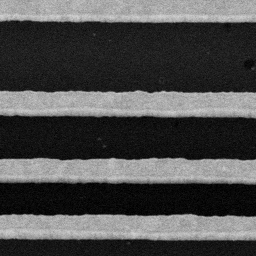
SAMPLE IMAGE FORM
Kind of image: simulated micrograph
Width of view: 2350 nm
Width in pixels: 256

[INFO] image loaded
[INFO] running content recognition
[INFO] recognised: lines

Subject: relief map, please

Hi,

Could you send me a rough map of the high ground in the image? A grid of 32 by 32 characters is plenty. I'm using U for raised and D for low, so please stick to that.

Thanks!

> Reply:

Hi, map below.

UUUUUUUUUUUUUUUUUUUUUUUUUUUUUUUU
UUUUUUUUUUUUUUUUUUUUUUUUUUUUUUUU
DDDDDDDDDDDDDDDDDDDDDDDDDDDDDDDD
DDDDDDDDDDDDDDDDDDDDDDDDDDDDDDDD
DDDDDDDDDDDDDDDDDDDDDDDDDDDDDDDD
DDDDDDDDDDDDDDDDDDDDDDDDDDDDDDDD
DDDDDDDDDDDDDDDDDDDDDDDDDDDDDDDD
DDDDDDDDDDDDDDDDDDDDDDDDDDDDDDDD
DDDDDDDDDDDDDDDDDDDDDDDDDDDDDDDD
DDDDDDDDDDDDDDDDDDDDDDDDDDDDDDDD
DDDDDDDDDDDDDDDDDDDDDDDDDDDDDDDD
DDDUDDDDDDDDDDDDDUDDDDDDDDDDDDDD
UUUUUUUUUUUUUUUUUUUUUUUUUUUUUUUU
UUUUUUUUUUUUUUUUUUUUUUUUUUUUUUUU
DDDDDDDDDDDDDDDDDDDDDDDDDDDDDDDD
DDDDDDDDDDDDDDDDDDDDDDDDDDDDDDDD
DDDDDDDDDDDDDDDDDDDDDDDDDDDDDDDD
DDDDDDDDDDDDDDDDDDDDDDDDDDDDDDDD
DDDDDDDDDDDDDDDDDDDDDDDDDDDDDDDD
DDDDDDDDDDDDDDDDDDDDDDDDDDDDDDDD
UUUUUUUUUUUUUUUUUUUUUUUUUUUUUUUU
UUUUUUUUUUUUUUUUUUUUUUUUUUUUUUUU
UUUUUUUUUUUUUUUUUUUUUUUUUUUUUUUU
DDDDDDDDDDDDDDDDDDDDDDDDDDDDDDDD
DDDDDDDDDDDDDDDDDDDDDDDDDDDDDDDD
DDDDDDDDDDDDDDDDDDDDDDDDDDDDDDDD
DDDDDDDDDDDDDDDDDDDDDDDDDDDDDDDD
UUUUUUUUUUUUUUUUUUUUUUUUUUUUUUUU
UUUUUUUUUUUUUUUUUUUUUUUUUUUUUUUU
DDDDDDDUUUUUUUUUUUUUUUUUUUUUUUUU
DDDDDDDDDDDDDDDDDDDDDDDDDDDDDDDD
DDDDDDDDDDDDDDDDDDDDDDDDDDDDDDDD